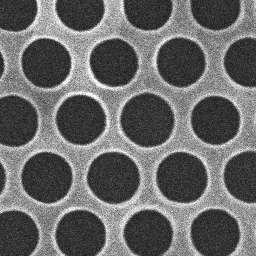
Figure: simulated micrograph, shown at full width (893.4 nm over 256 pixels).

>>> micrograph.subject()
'a regular array of holes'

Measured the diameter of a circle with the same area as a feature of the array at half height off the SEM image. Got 173 nm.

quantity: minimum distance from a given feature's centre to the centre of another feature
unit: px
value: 66.6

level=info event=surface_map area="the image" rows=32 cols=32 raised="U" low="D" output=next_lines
DDDDDUUDDDDDDUUDDDDDDDUUDDDDDDUU
DDDDDUUDDDDDDUUUDDDDDUUUDDDDDDUU
DDDDUUUUDDDDDUUUDDDDDUUUDDDDDDUU
DDDUUUUUUDDDUUUUUDDDUUUUUUDDUUUU
UUUUUUUUUUUUUUUUUUUUUUUUUUUUUUUU
UUUUDDDDUUUUDDDDUUUUDDDDDUUUUDDD
UUUDDDDDDUUDDDDDDUUUDDDDDUUUDDDD
UUUDDDDDDUUDDDDDDUUUDDDDDDUUDDDD
UUUDDDDDDUUDDDDDDUUUDDDDDDUUDDDD
UUUDDDDDUUUUDDDDDUUUDDDDDUUUUDDD
UUUUDDDUUUUUUDDDUUUUUDDDUUUUUUDD
UUUUUUUUUUUUUUUUUUUUUUUUUUUUUUUU
DDDUUUUUDDDDUUUUDDDDDUUUUDDDDUUU
DDDDUUUDDDDDDUUDDDDDDUUUDDDDDDUU
DDDDDUUDDDDDDUUDDDDDDDUUDDDDDDUU
DDDDDUUDDDDDDUUDDDDDDDUUDDDDDDUU
DDDDDUUDDDDDDUUDDDDDDUUUDDDDDDUU
DDDDUUUUDDDDUUUUDDDDDUUUUDDDDUUU
UUUUUUUUUUUUUUUUUUUUUUUUUUUUUUUU
UUUUDDDUUUUUDDDDUUUUUDDDUUUUUDDD
UUUDDDDDDUUDDDDDDUUUDDDDDUUUDDDD
DUUDDDDDDUUDDDDDDUUUDDDDDDUUDDDD
DUUDDDDDDUUDDDDDDDUUDDDDDDUUDDDD
DUUDDDDDDUUDDDDDDUUUDDDDDDUUDDDD
UUUUDDDDUUUUDDDDDUUUUDDDDUUUUDDD
UUUUUUUUUUUUUUUUUUUUUUUUUUUUUUUU
DDDUUUUUUDDUUUUUUDDDUUUUUDDDUUUU
DDDDUUUUDDDDDUUUDDDDDUUUDDDDDUUU
DDDDDUUDDDDDDUUUDDDDDDUUDDDDDDUU
DDDDDUUDDDDDDUUUDDDDDDUUDDDDDDUU
DDDDDUUDDDDDDUUUDDDDDUUUDDDDDDUU
DDDDUUUUDDDDUUUUUDDDDUUUUDDDDUUU